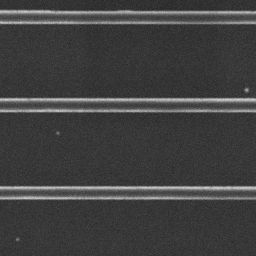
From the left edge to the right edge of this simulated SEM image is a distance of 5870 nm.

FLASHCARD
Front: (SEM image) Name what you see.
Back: lines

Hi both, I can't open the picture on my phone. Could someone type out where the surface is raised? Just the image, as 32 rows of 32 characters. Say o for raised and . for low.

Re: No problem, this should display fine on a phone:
................................
oooooooooooooooooooooooooooooooo
oooooooooooooooooooooooooooooooo
................................
................................
................................
................................
................................
................................
................................
................................
................................
oooooooooooooooooooooooooooooooo
oooooooooooooooooooooooooooooooo
................................
................................
................................
................................
................................
................................
................................
................................
................................
oooooooooooooooooooooooooooooooo
oooooooooooooooooooooooooooooooo
................................
................................
................................
................................
................................
................................
................................